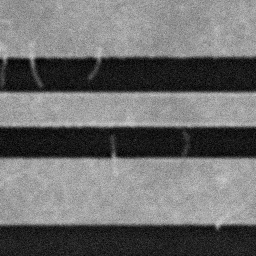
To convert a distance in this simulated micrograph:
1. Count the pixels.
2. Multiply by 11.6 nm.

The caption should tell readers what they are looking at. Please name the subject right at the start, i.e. lines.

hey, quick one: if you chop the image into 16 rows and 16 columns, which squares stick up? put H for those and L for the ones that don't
HHHHHHHHHHHHHHHH
HHHHHHHHHHHHHHHH
HHHHHHHHHHHHHHHH
HHHHHHHHHHHHHHHH
LLLLLLLLLLLLLLLL
LLLLLLLLLLLLLLLL
HHHHHHHHHHHHHHHH
HHHHHHHHHHHHHHHH
LLLLLLLLLLLLLLLL
LLLLLLLLLLLLLLLL
HHHHHHHHHHHHHHHH
HHHHHHHHHHHHHHHH
HHHHHHHHHHHHHHHH
HHHHHHHHHHHHHHHH
LLLLLLLLLLLLLLLL
LLLLLLLLLLLLLLLL